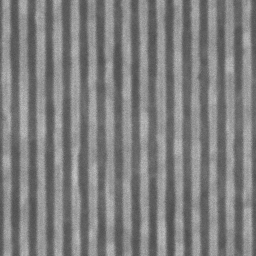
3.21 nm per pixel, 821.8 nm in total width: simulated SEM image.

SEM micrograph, parallel lines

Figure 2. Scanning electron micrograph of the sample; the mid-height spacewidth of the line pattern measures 34.5 nanometres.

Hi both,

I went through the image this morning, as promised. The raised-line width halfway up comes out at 20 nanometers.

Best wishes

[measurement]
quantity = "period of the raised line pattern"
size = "55.1 nanometers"